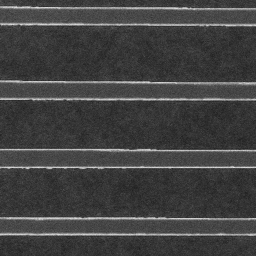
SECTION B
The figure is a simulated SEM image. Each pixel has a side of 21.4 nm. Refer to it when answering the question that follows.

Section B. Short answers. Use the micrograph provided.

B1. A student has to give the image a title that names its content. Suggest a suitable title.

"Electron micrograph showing lines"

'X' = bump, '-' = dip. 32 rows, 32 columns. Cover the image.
--------------------------------
XXXXXXXXXXXXXXXXXXXXXXXXXXXXXXXX
XXXXXXXXXXXXXXXXXXXXXXXXXXXXXXXX
--------------------------------
--------------------------------
--------------------------------
--------------------------------
--------------------------------
--------------------------------
--------------------------------
XXXXXXXXXXXXXXXXXXXXXXXXXXXXXXXX
XXXXXXXXXXXXXXXXXXXXXXXXXXXXXXXX
--------------------------------
--------------------------------
--------------------------------
--------------------------------
--------------------------------
--------------------------------
--------------------------------
XXXXXXXXXXXXXXXXXXXXXXXXXXXXXXXX
XXXXXXXXXXXXXXXXXXXXXXXXXXXXXXXX
--------------------------------
--------------------------------
--------------------------------
--------------------------------
--------------------------------
--------------------------------
XXXXXXXXXXXXXXXXXXXXXXXXXXXXXXXX
XXXXXXXXXXXXXXXXXXXXXXXXXXXXXXXX
--------------------------------
--------------------------------
--------------------------------